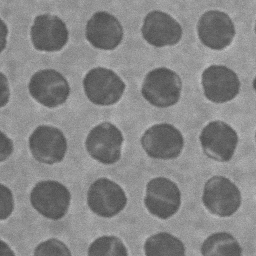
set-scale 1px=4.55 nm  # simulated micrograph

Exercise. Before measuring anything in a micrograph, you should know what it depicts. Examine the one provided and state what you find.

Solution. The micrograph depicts a regular array of holes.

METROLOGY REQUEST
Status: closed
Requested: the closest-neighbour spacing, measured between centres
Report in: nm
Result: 248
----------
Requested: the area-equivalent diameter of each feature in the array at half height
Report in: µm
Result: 0.183